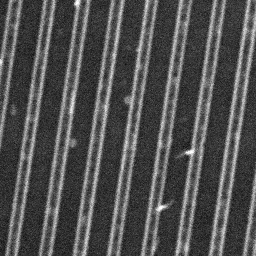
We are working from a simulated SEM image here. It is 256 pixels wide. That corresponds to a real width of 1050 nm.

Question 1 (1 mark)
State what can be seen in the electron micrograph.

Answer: parallel lines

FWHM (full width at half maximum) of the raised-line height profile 45.6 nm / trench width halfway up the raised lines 92.2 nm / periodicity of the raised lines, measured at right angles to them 0.138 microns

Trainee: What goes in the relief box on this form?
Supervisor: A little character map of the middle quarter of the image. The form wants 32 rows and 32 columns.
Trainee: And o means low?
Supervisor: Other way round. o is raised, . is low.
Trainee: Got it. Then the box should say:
.ooo......oo......ooo......oo...
.ooo.....ooo......ooo......oo...
.ooo.....ooo......oo......ooo...
.oo......ooo......oo......ooo...
.oo......ooo......oo......ooo...
ooo......ooo......oo......ooo...
ooo......oo......ooo......oo....
ooo......oo......ooo......oo....
ooo.....ooo......oo......ooo....
oo......ooo......oo......ooo....
oo......ooo......oo......ooo....
oo......ooo.....ooo......ooo....
oo......ooo.....ooo......ooo....
oo......oo......ooo......oo.....
oo......oo......ooo......oo.....
oo.....ooo......oo......ooo.....
o......ooo......oo......ooo.....
o......ooo......oo......ooo.....
o......ooo......oo......ooo.....
o......oo.......oo......ooo.....
o......oo......ooo......oo......
o.....ooo......ooo.....ooo......
o.....ooo......oo......ooo......
......ooo......oo......ooo......
......ooo......oo......ooo......
......ooo......oo......ooo.....o
......oo......ooo......oo......o
......oo......ooo......oo......o
.....ooo......ooo.....ooo......o
.....ooo......oo......ooo......o
.....ooo......oo......ooo......o
.....ooo.....ooo......ooo.....oo